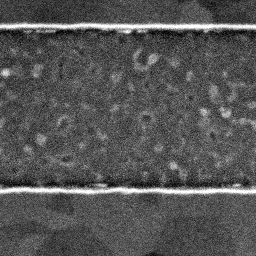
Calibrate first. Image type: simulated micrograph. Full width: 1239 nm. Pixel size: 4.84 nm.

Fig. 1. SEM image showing one or a few lines or trenches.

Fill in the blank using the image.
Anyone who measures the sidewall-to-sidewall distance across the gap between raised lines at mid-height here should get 796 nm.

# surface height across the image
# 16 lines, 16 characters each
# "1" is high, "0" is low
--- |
1111111111111111
1111111111111111
0000000000000000
0000000000000000
0000000000000000
0000000000000000
0000000000000000
0000000000000000
0000000000000000
0000000000000000
0000000000000000
0000000000000000
1111111111111111
1111111111111111
1111111111111111
1111111111111111